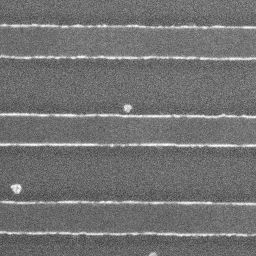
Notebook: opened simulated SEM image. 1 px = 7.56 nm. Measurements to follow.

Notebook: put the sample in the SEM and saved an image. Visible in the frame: lines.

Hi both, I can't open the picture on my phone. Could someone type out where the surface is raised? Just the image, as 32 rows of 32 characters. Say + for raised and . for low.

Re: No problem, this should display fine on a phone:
................................
................................
................................
++++++++++++++++++++++++++++++++
++++++++++++++++++++++++++++++++
++++++++++++++++++++++++++++++++
++++++++++++++++++++++++++++++++
................................
................................
................................
................................
................................
................................
................................
++++++++++.++++.................
++++++++++++++++++++++++++++++++
++++++++++++++++++++++++++++++++
++++++++++++++++++++++++++++++++
................................
................................
................................
................................
................................
................................
................................
++++++++++++++++++++++++++++++++
++++++++++++++++++++++++++++++++
++++++++++++++++++++++++++++++++
++++++++++++++++++++++++++++++++
................................
................................
................................